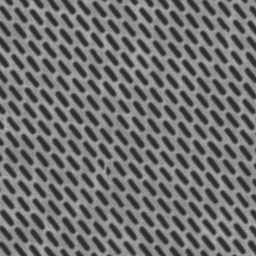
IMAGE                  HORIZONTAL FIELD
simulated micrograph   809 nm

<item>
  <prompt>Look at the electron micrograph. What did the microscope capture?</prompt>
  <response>a regular array of holes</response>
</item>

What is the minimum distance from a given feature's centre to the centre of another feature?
48.5 nanometres